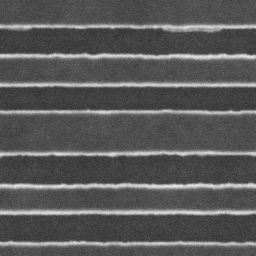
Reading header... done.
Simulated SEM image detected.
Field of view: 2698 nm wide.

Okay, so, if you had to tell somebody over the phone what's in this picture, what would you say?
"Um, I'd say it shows lines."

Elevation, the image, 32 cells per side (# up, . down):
################################
################################
################################
................................
................................
................................
................................
################################
################################
################################
################################
................................
................................
................................
################################
################################
################################
################################
################################
................................
................................
................................
................................
################################
################################
################################
################################
................................
................................
................................
################################
################################